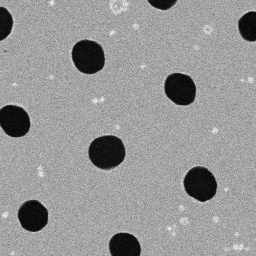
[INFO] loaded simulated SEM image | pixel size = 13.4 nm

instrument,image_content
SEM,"holes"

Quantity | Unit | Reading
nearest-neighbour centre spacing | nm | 1300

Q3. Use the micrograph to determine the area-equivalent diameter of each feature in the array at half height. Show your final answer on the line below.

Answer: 447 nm